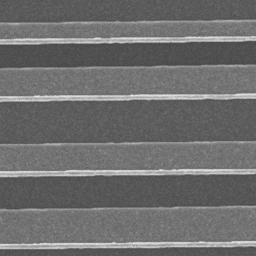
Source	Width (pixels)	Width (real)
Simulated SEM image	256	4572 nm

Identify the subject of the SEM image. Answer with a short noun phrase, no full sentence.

lines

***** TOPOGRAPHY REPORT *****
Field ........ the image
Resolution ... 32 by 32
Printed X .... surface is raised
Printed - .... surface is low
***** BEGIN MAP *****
--------------------------------
--------------------------------
--------------------------------
XXXXXXXXXXXXXXXXXXXXXXXXXXXXXXXX
XXXXXXXXXXXXXXXXXXXXXXXXXXXXXXXX
--------------------------------
--------------------------------
--------------------------------
-----------XXXXXXXXXXXXXXXXXXXXX
XXXXXXXXXXXXXXXXXXXXXXXXXXXXXXXX
XXXXXXXXXXXXXXXXXXXXXXXXXXXXXXXX
XXXXXXXXXXXXXXXXXXXXXXXXXXXXXXXX
XXXXXXX-------------------------
--------------------------------
--------------------------------
--------------------------------
--------------------------------
--------------------------------
XXXXXXXXXXXXXXXXXXXXXXXXXXXXXXXX
XXXXXXXXXXXXXXXXXXXXXXXXXXXXXXXX
XXXXXXXXXXXXXXXXXXXXXXXXXXXXXXXX
XXXXXXXXXXXXXXXXXXXXXXXXXXXXXXXX
--------------------------------
--------------------------------
--------------------------------
--------------------------------
XXXXXXXXXXXXXXXXXXXXXXXXXXXXXXXX
XXXXXXXXXXXXXXXXXXXXXXXXXXXXXXXX
XXXXXXXXXXXXXXXXXXXXXXXXXXXXXXXX
XXXXXXXXXXXXXXXXXXXXXXXXXXXXXXXX
XXXXXXXXXXXXXXXXXXXXXXXXXXXXXXXX
--------------------------------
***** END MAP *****